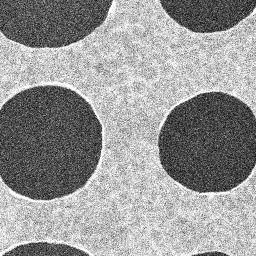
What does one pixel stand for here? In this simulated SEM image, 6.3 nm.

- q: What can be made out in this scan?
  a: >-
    holes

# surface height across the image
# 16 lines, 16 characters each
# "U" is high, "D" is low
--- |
DDDDDDDUUUDDDDDD
DDDDDDUUUUUDDDDU
UDDDDUUUUUUUUUUU
UUUUUUUUUUUUUUUU
UUUUUUUUUUUUUUUU
UUDDUUUUUUUUUUUU
DDDDDDUUUUUDDDDU
DDDDDDUUUUDDDDDD
DDDDDDUUUUDDDDDD
DDDDDDUUUUDDDDDD
DDDDDDUUUUDDDDDD
DDDDDUUUUUUDDDDU
UUDUUUUUUUUUUUUU
UUUUUUUUUUUUUUUU
UUUUUUUUUUUUUUUU
UDDDDUUUUUUUUUUU